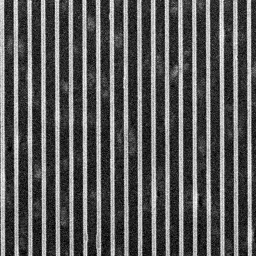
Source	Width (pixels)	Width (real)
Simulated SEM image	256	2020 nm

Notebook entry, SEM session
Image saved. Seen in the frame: parallel lines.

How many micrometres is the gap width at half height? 0.0838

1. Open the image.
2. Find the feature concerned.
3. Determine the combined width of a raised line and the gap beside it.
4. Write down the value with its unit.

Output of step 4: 0.108 microns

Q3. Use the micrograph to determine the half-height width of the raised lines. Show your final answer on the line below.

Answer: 25.6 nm